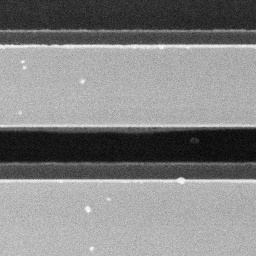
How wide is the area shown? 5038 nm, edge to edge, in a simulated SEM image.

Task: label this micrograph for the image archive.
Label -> lines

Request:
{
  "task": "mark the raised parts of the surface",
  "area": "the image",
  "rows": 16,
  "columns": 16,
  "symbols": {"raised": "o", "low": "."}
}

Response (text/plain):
................
................
oooooooooooooooo
oooooooooooooooo
oooooooooooooooo
oooooooooooooooo
oooooooooooooooo
oooooooooooooooo
................
................
oooooooooooooooo
oooooooooooooooo
oooooooooooooooo
oooooooooooooooo
oooooooooooooooo
oooooooooooooooo